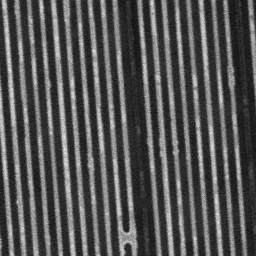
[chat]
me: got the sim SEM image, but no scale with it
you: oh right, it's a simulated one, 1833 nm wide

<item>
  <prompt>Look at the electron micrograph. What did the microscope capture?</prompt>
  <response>parallel lines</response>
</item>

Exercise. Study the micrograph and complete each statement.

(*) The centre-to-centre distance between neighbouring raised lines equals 87.7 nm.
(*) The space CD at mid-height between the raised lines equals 59.8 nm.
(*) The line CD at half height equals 26.8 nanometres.